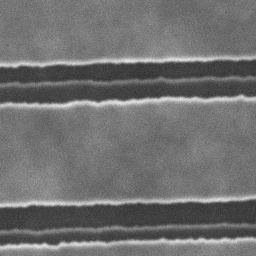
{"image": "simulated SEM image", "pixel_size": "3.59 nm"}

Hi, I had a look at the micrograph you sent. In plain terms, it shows lines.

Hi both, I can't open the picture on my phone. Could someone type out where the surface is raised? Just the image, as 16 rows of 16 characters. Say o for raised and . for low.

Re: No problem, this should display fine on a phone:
oooooooooooooooo
oooooooooooooooo
oooooooooooooooo
oooooooooooooooo
................
................
oooooooooooooooo
oooooooooooooooo
oooooooooooooooo
oooooooooooooooo
oooooooooooooooo
oooooooooooooooo
ooooooooooooooo.
................
................
oooooooooooooooo